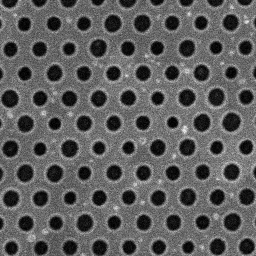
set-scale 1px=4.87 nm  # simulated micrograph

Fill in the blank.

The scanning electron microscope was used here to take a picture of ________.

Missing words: a regular array of holes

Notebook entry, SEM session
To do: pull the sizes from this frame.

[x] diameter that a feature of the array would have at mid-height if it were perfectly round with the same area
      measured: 77 nm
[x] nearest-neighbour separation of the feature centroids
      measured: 139 nm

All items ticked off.